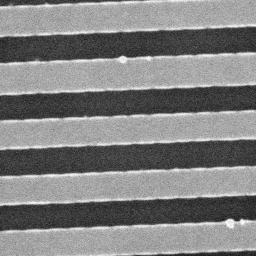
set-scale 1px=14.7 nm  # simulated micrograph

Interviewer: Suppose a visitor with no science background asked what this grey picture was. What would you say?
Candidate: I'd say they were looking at lines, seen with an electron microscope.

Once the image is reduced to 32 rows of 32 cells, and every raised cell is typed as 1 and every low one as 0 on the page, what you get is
00000000011111111111111111111111
11111111111111111111111111111111
11111111111111111111111111111111
11111111111111111111111111000000
10000000000000000000000000000000
00000000000000000000000000000000
00000000000000000000000000000000
00000000000111111111111111111111
11111111111111111111111111111111
11111111111111111111111111111111
11111111111111111111111111111111
11111111000000000000000000000000
00000000000000000000000000000000
00000000000000000000000000000000
00000000000000001111111111111111
11111111111111111111111111111111
11111111111111111111111111111111
11111111111111111111111111100000
11110000000000000000000000000000
00000000000000000000000000000000
00000000000000000000000000000000
00000000000000011111111111111111
11111111111111111111111111111111
11111111111111111111111111111111
11111111111111111111111111110000
11100000000000000000000000000000
00000000000000000000000000000000
00000000000000000000000000000000
00000000000111111111111111111111
11111111111111111111111111111111
11111111111111111111111111111111
11111111111111111111111110000000